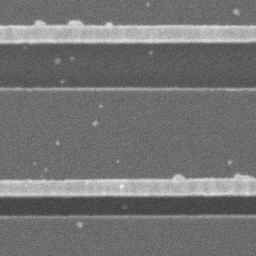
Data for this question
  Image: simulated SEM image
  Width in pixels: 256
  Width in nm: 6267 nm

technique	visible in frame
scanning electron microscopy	lines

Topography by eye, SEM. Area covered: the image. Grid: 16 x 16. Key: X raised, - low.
XXXXXXXXXXXXXXXX
XXXXXXXXXXXXXXXX
XXXXXXXXXXXXXXXX
----------------
----------------
----------------
XXXXXXXXXXXXXXXX
XXXXXXXXXXXXXXXX
XXXXXXXXXXXXXXXX
XXXXXXXXXXXXXXXX
XXXXXXXXXXXXXXXX
XXXXXXXXXXXXXXXX
----------------
----------------
XXXXXXXXXXXXXXXX
XXXXXXXXXXXXXXXX